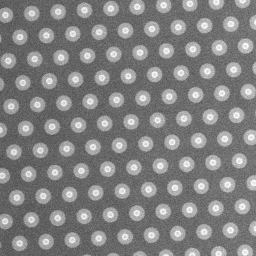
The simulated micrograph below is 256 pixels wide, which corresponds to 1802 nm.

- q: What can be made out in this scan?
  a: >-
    an array of small figures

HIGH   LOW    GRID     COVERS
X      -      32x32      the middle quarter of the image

-----------------------------X--
---------------XX----XXX----XXX-
--XX----XXX---XXXX---XXX---XXXX-
-XXXX---XXX---XXXX---XXX----XXX-
-XXXX---XXX----XX---------------
--XX----------------------------
-------------------------XX----X
------------XX----XXX----XXX---X
X----XXX---XXXX---XXX----XXX---X
XX---XXX---XXXX---XXX----XXX----
XX---XXX----XX------------------
X-------------------------------
----------------------XX----XXX-
---X-----XX----XXX----XXX---XXXX
--XXX---XXXX---XXXX---XXX---XXXX
--XXX---XXXX---XXX----XXX-------
--XXX----XX---------------------
--------------------------------
-------------------XXX---XXXX---
XX----XXX---XXXX---XXX---XXXX---
XX---XXXX---XXXX---XXX---XXXX---
XXX---XXX---XXX----XX-----------
XX----XX------------------------
------------------------------XX
-----------X----XXX---XXXX---XXX
---XXX---XXXX---XXX---XXXX---XXX
--XXXX---XXXX---XXX---XXXX---XXX
---XXX----XX-----XX-------------
----X---------------------------
---------------------------XX---
-------XX----XXX---XXXX---XXX---
XXX---XXXX---XXX---XXXX---XXXX--